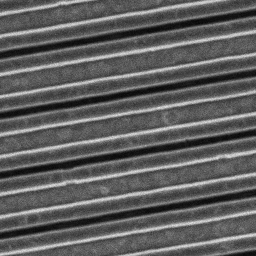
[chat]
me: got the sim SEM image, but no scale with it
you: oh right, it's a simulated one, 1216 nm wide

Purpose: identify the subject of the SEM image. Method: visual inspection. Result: parallel lines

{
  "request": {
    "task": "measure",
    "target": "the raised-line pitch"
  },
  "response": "138 nm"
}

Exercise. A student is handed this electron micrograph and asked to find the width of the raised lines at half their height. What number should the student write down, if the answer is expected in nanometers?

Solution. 72.6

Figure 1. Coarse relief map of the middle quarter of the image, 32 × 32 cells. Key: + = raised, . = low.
.............................+++
.......................+++++++++
.................+++++++++++++++
............++++++++++++++++++++
......++++++++++++++++++++++....
++++++++++++++++++++++..........
++++++++++++++++............++++
+++++++++++...........++++++++++
++++............++++++++++++++++
............++++++++++++++++++++
......+++++++++++++++++++++.....
++++++++++++++++++++++..........
++++++++++++++++................
++++++++++......................
+++.............................
.............................+++
.......................+++++++++
.................+++++++++++++++
...........+++++++++++++++++++++
.....+++++++++++++++++++++++....
++++++++++++++++++++++..........
++++++++++++++++.............+++
++++++++++............++++++++++
++++.............+++++++++++++++
..........++++++++++++++++++++++
....++++++++++++++++++++++++....
++++++++++++++++++++++..........
++++++++++++++++................
++++++++++......................
++++............................
..............................++
.......................+++++++++